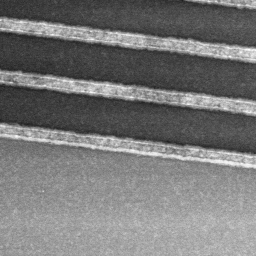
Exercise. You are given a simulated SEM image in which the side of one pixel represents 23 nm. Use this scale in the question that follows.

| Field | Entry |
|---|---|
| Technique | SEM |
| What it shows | parallel lines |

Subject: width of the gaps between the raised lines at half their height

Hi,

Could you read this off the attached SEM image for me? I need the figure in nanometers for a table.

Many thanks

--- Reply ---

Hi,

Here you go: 954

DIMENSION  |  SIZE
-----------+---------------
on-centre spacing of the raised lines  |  1210 nm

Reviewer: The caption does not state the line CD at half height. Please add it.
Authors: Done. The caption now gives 268 nanometers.